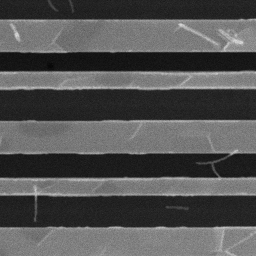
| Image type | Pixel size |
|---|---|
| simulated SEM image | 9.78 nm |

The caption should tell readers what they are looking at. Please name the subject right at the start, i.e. lines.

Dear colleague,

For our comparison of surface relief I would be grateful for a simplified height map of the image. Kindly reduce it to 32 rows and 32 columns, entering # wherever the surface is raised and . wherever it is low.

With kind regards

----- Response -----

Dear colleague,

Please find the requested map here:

................................
................................
..............................##
################################
################################
################################
..########...##.................
................................
................................
################################
################################
................................
................................
................................
................................
################################
################################
################################
################################
................................
................................
................................
################################
################################
................................
................................
................................
................................
......##.##..###...##.##..######
################################
################################
################################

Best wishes